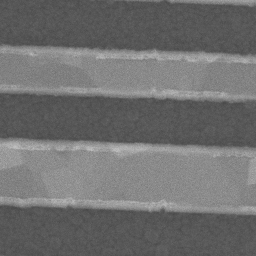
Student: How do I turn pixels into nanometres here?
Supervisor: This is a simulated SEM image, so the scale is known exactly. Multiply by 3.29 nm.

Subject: one or a few lines or trenches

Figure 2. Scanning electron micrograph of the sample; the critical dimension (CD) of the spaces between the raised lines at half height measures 178 nm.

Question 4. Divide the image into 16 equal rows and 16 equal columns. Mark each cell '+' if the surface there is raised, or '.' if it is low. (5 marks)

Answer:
................
................
................
++++++++++++....
++++++++++++++++
++++++++++++++++
................
................
................
+++++++++++++++.
++++++++++++++++
++++++++++++++++
++++++++++++++++
................
................
................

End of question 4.